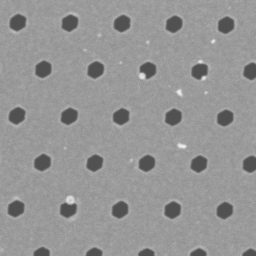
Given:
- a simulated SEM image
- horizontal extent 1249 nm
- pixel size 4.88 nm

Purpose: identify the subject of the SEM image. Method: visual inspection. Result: a regular array of holes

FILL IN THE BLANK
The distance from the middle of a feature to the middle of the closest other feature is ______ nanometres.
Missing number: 254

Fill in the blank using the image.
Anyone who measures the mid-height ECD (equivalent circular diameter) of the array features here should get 0.0823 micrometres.